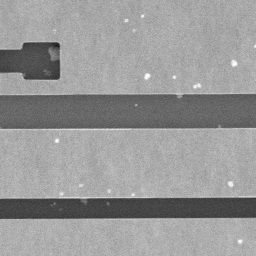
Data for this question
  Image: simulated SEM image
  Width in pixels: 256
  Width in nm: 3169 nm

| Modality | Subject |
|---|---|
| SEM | groups of lines, slits or small figures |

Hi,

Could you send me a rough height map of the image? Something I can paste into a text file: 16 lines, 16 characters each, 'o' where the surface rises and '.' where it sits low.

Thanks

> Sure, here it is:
oooooooooooooooo
oooooooooooooooo
oooooooooooooooo
....oooooooooooo
....oooooooooooo
oooooooooooooooo
................
................
oooooooooooooooo
oooooooooooooooo
oooooooooooooooo
oooooooooooooooo
................
................
oooooooooooooooo
oooooooooooooooo